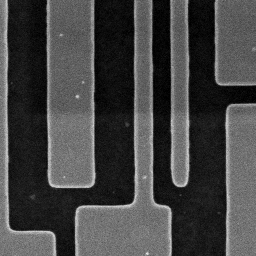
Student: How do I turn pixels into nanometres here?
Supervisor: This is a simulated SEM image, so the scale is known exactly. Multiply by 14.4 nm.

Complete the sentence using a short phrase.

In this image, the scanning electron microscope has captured wiring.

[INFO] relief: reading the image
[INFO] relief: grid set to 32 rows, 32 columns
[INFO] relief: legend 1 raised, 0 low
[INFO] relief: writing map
10000011111100000110011000011111
10000011111100000110011000011111
10000011111100000110011000011111
10000011111100000110011000011111
10000011111100000110011000011111
10000011111100000110011000011111
10000011111100000110011000011111
10000011111100000110011100011111
10000011111100000110011100011111
10000011111100000110011100011111
10000011111100000110011000001111
10000011111100000110011000000000
10000011111100000110011000000000
10000011111100000110011000001111
10000011111100000110011000001111
10000011111100000110011100001111
10000011111100000110011100001111
10000011111100000110001100001111
10000011111100000110001100001111
10000011111100000110011100001111
10000011111100000110011100001111
10000011111100000110011100001111
10000011111100000110001000001111
10000000000000000110000000001111
10000000000000000110000000001111
10000000000000001111000000001111
10000000001111111111100000001111
10000000011111111111100000001111
10000000011111111111100000001111
11111110011111111111100000001111
11111110011111111111100000001111
11111110011111111111100000001111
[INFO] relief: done